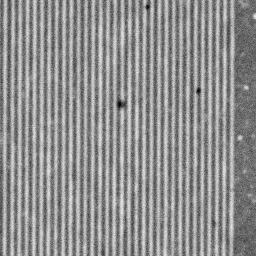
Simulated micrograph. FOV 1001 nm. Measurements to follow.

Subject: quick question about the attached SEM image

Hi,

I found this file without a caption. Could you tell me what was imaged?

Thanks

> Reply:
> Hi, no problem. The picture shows parallel lines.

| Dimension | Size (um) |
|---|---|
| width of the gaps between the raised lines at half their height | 0.0181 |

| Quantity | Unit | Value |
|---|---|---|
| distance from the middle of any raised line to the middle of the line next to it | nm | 28.6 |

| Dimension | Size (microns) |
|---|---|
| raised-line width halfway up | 0.0108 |